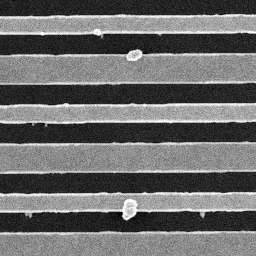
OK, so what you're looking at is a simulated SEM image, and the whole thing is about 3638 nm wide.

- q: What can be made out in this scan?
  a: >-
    lines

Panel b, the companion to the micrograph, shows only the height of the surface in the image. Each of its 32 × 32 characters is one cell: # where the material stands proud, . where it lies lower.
................................
................................
################################
################################
................................
................................
................##..............
################################
################################
################################
#############.#.................
................................
................................
################################
################################
................................
................................
................................
################################
################################
################################
###########################.....
................................
................................
################################
################################
#########....#.##.#.............
................................
................................
################################
################################
################################